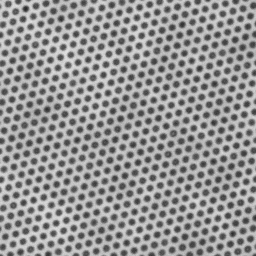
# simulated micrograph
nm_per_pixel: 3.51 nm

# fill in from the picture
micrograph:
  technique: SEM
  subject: a regular array of holes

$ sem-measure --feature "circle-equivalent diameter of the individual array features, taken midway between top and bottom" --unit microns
0.0257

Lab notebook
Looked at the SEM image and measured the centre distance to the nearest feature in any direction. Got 36.4 nanometres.